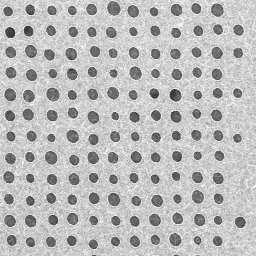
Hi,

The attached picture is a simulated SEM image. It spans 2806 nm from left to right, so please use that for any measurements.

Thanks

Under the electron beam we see a regular array of holes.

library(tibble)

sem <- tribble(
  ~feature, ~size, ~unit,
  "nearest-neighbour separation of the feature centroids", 216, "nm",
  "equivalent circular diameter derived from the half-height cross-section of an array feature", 120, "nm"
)